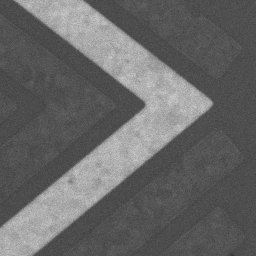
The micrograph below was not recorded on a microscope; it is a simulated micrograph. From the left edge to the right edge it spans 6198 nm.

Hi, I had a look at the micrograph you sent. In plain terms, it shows groups of lines, slits or small figures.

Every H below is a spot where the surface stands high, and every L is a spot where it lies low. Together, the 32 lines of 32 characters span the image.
LLHHHHHHHHHLLLLHHHHHHHHLLLLLLLLL
LLLLHHHHHHHHLLLLHHHHHHHHHLLLLLLL
HLLLLHHHHHHHHLLLLLHHHHHHHHLLLLLL
HHLLLLHHHHHHHHHLLLLHHHHHHHHLLLLL
HHHLLLLLHHHHHHHHLLLLHHHHHHHHHLLL
HHHHHLLLLHHHHHHHHLLLLHHHHHHHHHLL
HHHHHHLLLLHHHHHHHHHLLLLHHHHHHHLL
HHHHHHHLLLLHHHHHHHHHLLLLHHHHHLLL
HHHHHHHHHLLLLHHHHHHHHLLLLHHHLLLL
LHHHHHHHHHLLLLHHHHHHHHLLLLLLLLLL
LLLHHHHHHHHLLLLHHHHHHHHHLLLLLLLL
LLLLHHHHHHHHLLLLLHHHHHHHHLLLLLLL
HLLLLHHHHHHHHHLLLLHHHHHHHHLLLLLL
HHLLLLHHHHHHHHLLLLHHHHHHHHLLLLLL
HLLLLHHHHHHHHLLLLHHHHHHHHLLLLLLL
LLLLHHHHHHHHLLLLHHHHHHHHLLLLLLLL
LLHHHHHHHHHLLLLHHHHHHHHLLLLHLLLL
LHHHHHHHHLLLLHHHHHHHHLLLLHHHHLLL
HHHHHHHHLLLLHHHHHHHHLLLLHHHHHLLL
HHHHHHHLLLLHHHHHHHHLLLLHHHHHHHLL
HHHHHHLLLLHHHHHHHHLLLLHHHHHHHHLL
HHHHHLLLHHHHHHHHHLLLLHHHHHHHHLLL
HHHLLLLHHHHHHHHLLLLHHHHHHHHLLLLL
HHLLLLHHHHHHHHLLLLHHHHHHHHLLLLLL
HLLLLHHHHHHHHLLLLHHHHHHHHLLLLLLL
LLLLHHHHHHHHLLLLHHHHHHHHLLLLLLLL
LLHHHHHHHHHLLLLHHHHHHHHLLLLHLLLL
LHHHHHHHHLLLLHHHHHHHHLLLLHHHHLLL
HHHHHHHHLLLLHHHHHHHHLLLLHHHHHHLL
HHHHHHHLLLLHHHHHHHHLLLLHHHHHHHLL
HHHHHHLLLLHHHHHHHHLLLLHHHHHHHHLL
HHHHHLLLHHHHHHHHHLLLLHHHHHHHHLLL